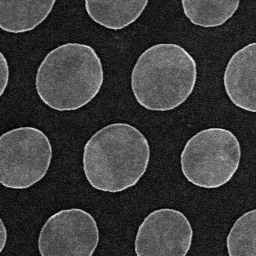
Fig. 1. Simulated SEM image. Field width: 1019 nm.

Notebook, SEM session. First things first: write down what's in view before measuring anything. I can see raised bodies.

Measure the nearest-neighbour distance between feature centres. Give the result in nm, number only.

371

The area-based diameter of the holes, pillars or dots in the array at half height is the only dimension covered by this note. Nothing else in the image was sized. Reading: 262 nm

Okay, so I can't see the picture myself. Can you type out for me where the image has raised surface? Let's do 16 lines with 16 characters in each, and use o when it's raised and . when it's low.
ooo..oooo..oooo.
oo....oo....oo..
................
...ooo...ooo...o
..oooo..oooo..oo
..oooo..oooo..oo
...oo....oo....o
................
ooo...ooo...ooo.
ooo..oooo..oooo.
ooo..oooo..oooo.
oo....oo....oo..
................
...ooo...oo....o
...ooo...ooo..oo
..oooo..oooo..oo